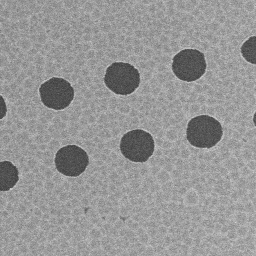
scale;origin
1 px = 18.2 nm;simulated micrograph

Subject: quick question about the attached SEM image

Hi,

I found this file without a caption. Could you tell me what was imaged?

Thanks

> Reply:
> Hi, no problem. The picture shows holes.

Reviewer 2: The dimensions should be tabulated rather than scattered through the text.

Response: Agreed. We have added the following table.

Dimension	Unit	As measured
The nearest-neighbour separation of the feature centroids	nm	1230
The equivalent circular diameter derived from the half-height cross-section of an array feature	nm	638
